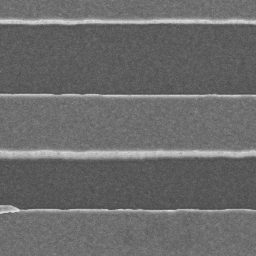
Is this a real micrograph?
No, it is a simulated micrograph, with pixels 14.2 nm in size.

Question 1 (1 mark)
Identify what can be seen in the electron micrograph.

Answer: lines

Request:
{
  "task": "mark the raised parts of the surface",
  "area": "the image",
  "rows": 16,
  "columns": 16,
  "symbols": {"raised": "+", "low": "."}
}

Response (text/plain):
++++++++++++++++
................
................
................
................
................
++++++++++++++++
++++++++++++++++
++++++++++++++++
++++++++++++++++
................
................
................
++++++++++++++++
++++++++++++++++
++++++++++++++++